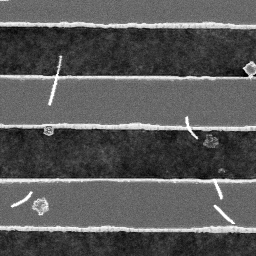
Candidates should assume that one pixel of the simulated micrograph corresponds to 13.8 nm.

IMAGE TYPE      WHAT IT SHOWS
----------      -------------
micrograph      lines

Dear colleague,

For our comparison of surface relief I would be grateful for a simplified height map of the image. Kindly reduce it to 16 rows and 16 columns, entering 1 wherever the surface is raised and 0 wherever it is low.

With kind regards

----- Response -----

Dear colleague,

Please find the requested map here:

1111111111111111
1111111111111111
0000000000000000
0000000000000000
0000000000000001
1111111111111111
1111111111111111
1111111111111111
0000000000000000
0000000000000000
0000000000000000
1111111111111111
1111111111111111
1111111111111111
0000000000000000
0000000000000000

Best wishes